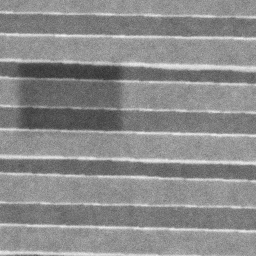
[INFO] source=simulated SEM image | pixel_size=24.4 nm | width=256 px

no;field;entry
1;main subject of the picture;lines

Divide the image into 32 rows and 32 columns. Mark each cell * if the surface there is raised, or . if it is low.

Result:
********************************
.*******************************
................................
................................
*********.......................
********************************
********************************
********************************
..............................**
................................
*****************************...
********************************
********************************
.........***********************
................................
................................
**************..................
********************************
********************************
********************************
................................
................................
*************************.......
********************************
********************************
............********************
................................
................................
**************..................
********************************
********************************
********************************